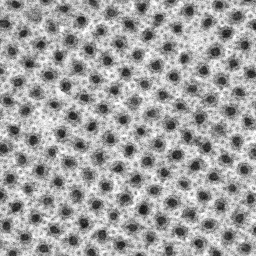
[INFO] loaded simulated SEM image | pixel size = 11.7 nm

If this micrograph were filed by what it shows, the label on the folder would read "a regular array of raised bodies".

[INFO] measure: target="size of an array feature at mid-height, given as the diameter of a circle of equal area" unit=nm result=127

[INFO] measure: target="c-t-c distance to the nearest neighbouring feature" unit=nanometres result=245